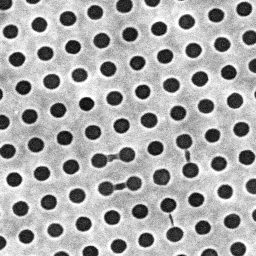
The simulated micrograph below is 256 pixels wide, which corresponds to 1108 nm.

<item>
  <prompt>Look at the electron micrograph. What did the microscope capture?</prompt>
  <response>a regular array of holes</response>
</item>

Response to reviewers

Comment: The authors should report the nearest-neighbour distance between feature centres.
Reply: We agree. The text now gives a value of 0.124 microns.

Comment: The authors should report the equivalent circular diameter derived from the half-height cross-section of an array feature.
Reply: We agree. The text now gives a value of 15.8 pixels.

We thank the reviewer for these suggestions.